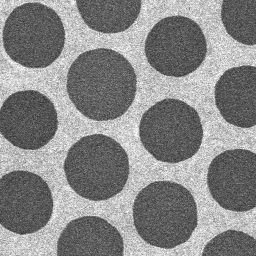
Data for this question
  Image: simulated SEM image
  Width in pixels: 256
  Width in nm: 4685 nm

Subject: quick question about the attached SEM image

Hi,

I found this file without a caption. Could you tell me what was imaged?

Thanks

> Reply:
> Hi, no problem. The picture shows holes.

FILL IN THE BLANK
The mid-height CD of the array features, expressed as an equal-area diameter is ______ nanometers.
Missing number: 1200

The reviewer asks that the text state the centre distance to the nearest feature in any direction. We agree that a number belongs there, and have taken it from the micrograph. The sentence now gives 1.52 um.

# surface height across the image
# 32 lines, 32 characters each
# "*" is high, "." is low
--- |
***..*****........**********....
*......***.......***********....
*.......**.......***....****....
........***.....***......***....
........**********........***...
........**********........****..
*.......***....***........******
**.....**.......**........******
****.****........**......****...
********.........****..*****....
********.........**********.....
**...***.........**********.....
*.....***........***...****.....
.......***......***.....***.....
.......****....***.......***....
.......**********........****...
.......**********........*******
*.....****....****.......*******
**...****......***.......*******
********........***.....***.....
********........**********......
*...****........**********......
......**........**********......
......***......***.....***......
......****....***.......**......
.......**********........**.....
.......**********........*******
......***....****........*******
*....***......***.......********
*******........**.......***....*
*******........****....***......
*******........**********.......